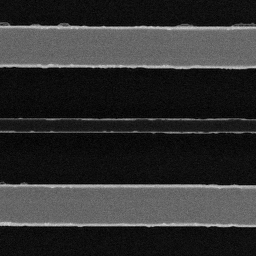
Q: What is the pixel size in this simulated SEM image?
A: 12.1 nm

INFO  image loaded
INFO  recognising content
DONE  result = lines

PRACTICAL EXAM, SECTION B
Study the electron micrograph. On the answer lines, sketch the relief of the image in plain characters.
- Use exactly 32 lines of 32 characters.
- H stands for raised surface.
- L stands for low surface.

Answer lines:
LLLLLLLLLLLLLLLLLLLLLLLLLLLLLLLL
LLLLLLLLLLLLLLLLLLLLLLLLLLLLLLLL
LLLLLLLLLLLLLLLLLLLLLLLLLLLLLLLL
HHHHHHHHHHHHHHHHHHHHHHHHHHHHHHHH
HHHHHHHHHHHHHHHHHHHHHHHHHHHHHHHH
HHHHHHHHHHHHHHHHHHHHHHHHHHHHHHHH
HHHHHHHHHHHHHHHHHHHHHHHHHHHHHHHH
HHHHHHHHHHHHHHHHHHHHHHHHHHHHHHHH
LLLLLLLLLLLLLLLLLLLLLLHHLLLLLHHL
LLLLLLLLLLLLLLLLLLLLLLLLLLLLLLLL
LLLLLLLLLLLLLLLLLLLLLLLLLLLLLLLL
LLLLLLLLLLLLLLLLLLLLLLLLLLLLLLLL
LLLLLLLLLLLLLLLLLLLLLLLLLLLLLLLL
LLLLLLLLLLLLLLLLLLLLLLLLLLLLLLLL
LLLLLLLLLLLLLLLLLLLLLLLLLLLLLLLL
HHHHHHHHHHHHHHHHHHHHHHHHHHHHHHHH
HHHHHHHHHHHHHHHHHHHHHHHHHHHHHHHH
LLLLLLLLLLLLLLLLLLLLLLLLLLLLLLLL
LLLLLLLLLLLLLLLLLLLLLLLLLLLLLLLL
LLLLLLLLLLLLLLLLLLLLLLLLLLLLLLLL
LLLLLLLLLLLLLLLLLLLLLLLLLLLLLLLL
LLLLLLLLLLLLLLLLLLLLLLLLLLLLLLLL
LLLLLLLLLLLLLLLLLLLLLLLLLLLLLLLL
HHHHHHHHHHHHHHHHHHHHHHHHHHHHHHHH
HHHHHHHHHHHHHHHHHHHHHHHHHHHHHHHH
HHHHHHHHHHHHHHHHHHHHHHHHHHHHHHHH
HHHHHHHHHHHHHHHHHHHHHHHHHHHHHHHH
HHHHHHHHHHHHHHHHHHHHHHHHHHHHHHHH
LLLLLLLLLLLLLLLLLLLLLLLLLLLLLLLL
LLLLLLLLLLLLLLLLLLLLLLLLLLLLLLLL
LLLLLLLLLLLLLLLLLLLLLLLLLLLLLLLL
LLLLLLLLLLLLLLLLLLLLLLLLLLLLLLLL